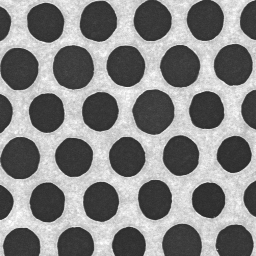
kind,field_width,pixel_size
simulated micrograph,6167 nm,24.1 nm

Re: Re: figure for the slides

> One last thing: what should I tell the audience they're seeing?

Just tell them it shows a regular array of holes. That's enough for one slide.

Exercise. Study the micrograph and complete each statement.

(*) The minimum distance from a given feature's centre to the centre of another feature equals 1.24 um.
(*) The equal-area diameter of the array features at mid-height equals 38.3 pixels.